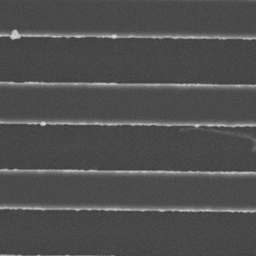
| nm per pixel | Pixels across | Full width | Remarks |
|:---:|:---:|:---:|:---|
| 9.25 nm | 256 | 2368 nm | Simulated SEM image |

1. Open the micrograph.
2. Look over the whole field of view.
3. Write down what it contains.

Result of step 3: lines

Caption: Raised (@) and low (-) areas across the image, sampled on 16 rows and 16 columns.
@@@@@@@@@@@@@@@@
@@@@@@@@@@@@@@@@
----------------
----------------
----------------
@@@@@@@@@@@@@@@@
@@@@@@@@@@@@@@@@
@@@@@@@@@@@@@@@@
----------------
----------------
----------------
@@@@@@@@@@@@@@@@
@@@@@@@@@@@@@@@@
----------------
----------------
----------------